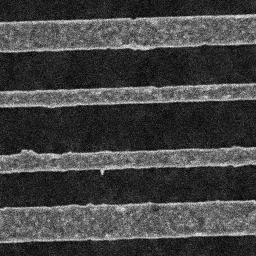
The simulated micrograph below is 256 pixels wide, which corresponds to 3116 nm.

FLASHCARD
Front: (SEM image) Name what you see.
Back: one or a few lines or trenches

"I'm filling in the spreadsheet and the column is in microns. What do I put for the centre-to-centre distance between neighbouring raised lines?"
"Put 0.763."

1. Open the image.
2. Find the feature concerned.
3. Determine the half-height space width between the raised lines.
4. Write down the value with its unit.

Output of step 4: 0.487 micrometres